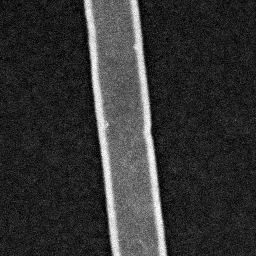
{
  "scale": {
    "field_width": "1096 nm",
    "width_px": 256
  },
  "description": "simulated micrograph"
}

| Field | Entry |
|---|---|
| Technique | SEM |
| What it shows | one or a few lines or trenches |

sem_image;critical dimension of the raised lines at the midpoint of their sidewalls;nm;198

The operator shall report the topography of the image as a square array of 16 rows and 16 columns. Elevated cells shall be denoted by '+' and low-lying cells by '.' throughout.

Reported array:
......++........
......+++.......
......+++.......
......+++.......
......+++.......
......+++.......
......+++.......
......+++.......
......+++.......
.......++.......
.......+++......
.......+++......
.......+++......
.......+++......
.......+++......
.......+++......